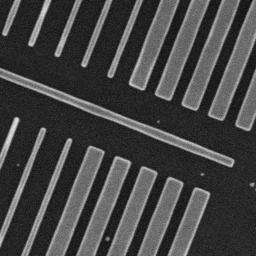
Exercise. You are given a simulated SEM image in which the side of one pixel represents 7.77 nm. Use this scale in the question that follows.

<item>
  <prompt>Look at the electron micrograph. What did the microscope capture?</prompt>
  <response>groups of lines, slits or small figures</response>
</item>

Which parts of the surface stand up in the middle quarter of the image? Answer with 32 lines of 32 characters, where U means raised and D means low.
DDDDDDDDDDDDUDDDDDUUUUDDDDUUUUDD
DDDDDDDDDDDUUDDDDDUUUUDDDUUUUUDD
DDDDDDDDDDDUDDDDDUUUUDDDDUUUUDDD
DDDDDDDDDDDDDDDDDUUUUDDDUUUUUDDD
DDDDDDDDDDDDDDDDDUUUUDDDUUUUDDDD
DDDDDDDDDDDDDDDDDUUUUDDDUUUUDDDU
DDDDDDDDDDDDDDDDDDDDDDDUUUUUDDDU
UDDDDDDDDDDDDDDDDDDDDDDUUUUDDDUU
UUUDDDDDDDDDDDDDDDDDDDDDUUUDDDUU
DUUUUUDDDDDDDDDDDDDDDDDDDDDDDDUU
DDDUUUUUDDDDDDDDDDDDDDDDDDDDDDUU
DDDDDUUUUUUDDDDDDDDDDDDDDDDDDDDD
DDDDDDDUUUUUUDDDDDDDDDDDDDDDDDDD
DDDDDDDDDDDUUUUUDDDDDDDDDDDDDDDD
DDDDDDDDDDDDDUUUUUDDDDDDDDDDDDDD
DDDDDDDDDDDDDDDDUUUUUDDDDDDDDDDD
DDDDDDDDDDDDDDDDDDUUUUUUDDDDDDDD
DDDDDDDDDDDDDDDDDDDDUUUUUUDDDDDD
DDDDDDDDDDDDDDDDDDDDDDDUUUUUUDDD
DUDDDDDDDDDDDDDDDDDDDDDDDUUUUUUD
UDDDDDDDDDDDDDDDDDDDDDDDDDDDUUUU
UDDDDDUUUDDDDDDDDDDDDDDDDDDDDDDU
UDDDDUUUUUDDDDDDDDDDDDDDDDDDDDDD
DDDDDUUUUUDDDUDDDDDDDDDDDDDDDDDD
DDDDDUUUUDDDUUUUDDDDDDDDDDDDDDDD
DDDDUUUUUDDDUUUUDDDDDDDDDDDDDDDD
DDDDUUUUDDDDUUUUDDDUUUDDDDDDDDDD
DDDUUUUUDDDUUUUUDDDUUUUDDDDDDDDD
DDDUUUUUDDDUUUUDDDUUUUUDDDDDDDDD
DDDUUUUDDDUUUUUDDDUUUUDDDDUUUDDD
DDUUUUUDDDUUUUDDDDUUUUDDDUUUUUDD
DDUUUUDDDDUUUUDDDUUUUUDDDUUUUDDD